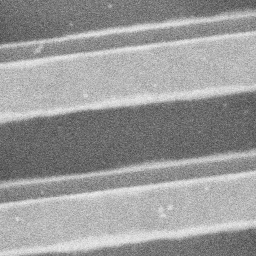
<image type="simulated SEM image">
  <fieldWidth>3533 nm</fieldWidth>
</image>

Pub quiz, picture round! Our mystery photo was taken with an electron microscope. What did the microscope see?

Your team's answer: lines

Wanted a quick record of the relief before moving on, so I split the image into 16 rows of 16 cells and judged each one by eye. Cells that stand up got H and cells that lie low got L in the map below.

LLLLLLLLLLLLLLLL
LLLLLLLLLLLHHHHH
LLLLHHHHHHHHHHHH
HHHHHHHHHHHHHHHH
HHHHHHHHHHHHHHHH
HHHHHHHHHHHHHHHH
HHHHHHHHLLLLLLLL
LLLLLLLLLLLLLLLL
LLLLLLLLLLLLLLLL
LLLLLLLLLLLLLLLL
LLLLLLLLLHHHHHHH
LHHHHHHHHHHHHHHH
HHHHHHHHHHHHHHHH
HHHHHHHHHHHHHHHH
HHHHHHHHHHHHLLLL
HHHHLLLLLLLLLLLL